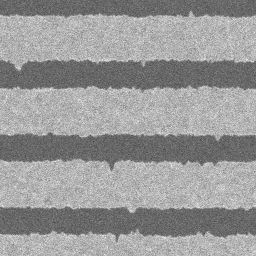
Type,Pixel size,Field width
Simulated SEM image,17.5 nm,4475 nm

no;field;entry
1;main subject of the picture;one or a few lines or trenches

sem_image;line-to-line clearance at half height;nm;494